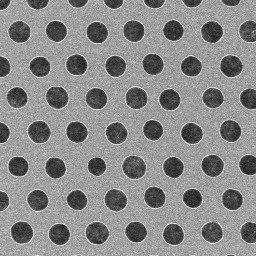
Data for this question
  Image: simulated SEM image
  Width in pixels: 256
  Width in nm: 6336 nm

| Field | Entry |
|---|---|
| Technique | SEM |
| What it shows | a regular array of holes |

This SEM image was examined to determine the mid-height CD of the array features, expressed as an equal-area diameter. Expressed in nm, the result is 531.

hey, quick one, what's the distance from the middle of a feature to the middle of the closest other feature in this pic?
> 924 nm